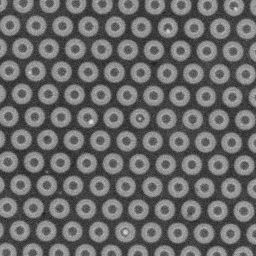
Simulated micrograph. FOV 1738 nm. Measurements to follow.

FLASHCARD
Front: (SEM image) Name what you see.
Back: an array of small figures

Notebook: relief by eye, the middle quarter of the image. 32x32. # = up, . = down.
#...####...###...####...###....#
##..####..#####..####..#####..##
##..####..#####..#####.#####..##
#...####...####..####...####..##
............#.....##....###....#
.###....##.....##...............
#####..####...####..####...####.
#####..#####.#####..#####..####.
#####..#####.#####..#####..####.
.###...####...####..####...####.
................................
#...###....###....##....###....#
##..####..#####..####..#####..##
##.#####..#####..####..#####..##
#...####..#####..####..#####..##
.....##....###...####...###...##
................................
.###...####...###....###...###..
#####..####..#####..#####..####.
#####..####..#####..####..#####.
#####..####..#####..####...####.
........##.....##....##....###..
.....#..........................
#...####..####...####...###...##
##.#####..#####.#####..#####..##
#..#####..#####.#####..#####..##
#...####..####...####..#####..##
.........................#.....#
.###....##....###....##.....#...
#####..####..#####..####..#####.
#####..####..#####..####..#####.
#####..####..#####..####..#####.